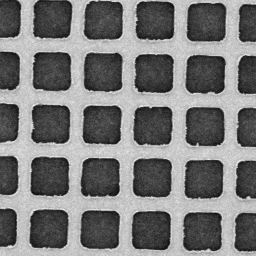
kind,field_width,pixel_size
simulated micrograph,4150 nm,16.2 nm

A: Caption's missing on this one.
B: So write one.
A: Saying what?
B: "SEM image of a regular array of holes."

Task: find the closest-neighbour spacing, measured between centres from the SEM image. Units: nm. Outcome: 828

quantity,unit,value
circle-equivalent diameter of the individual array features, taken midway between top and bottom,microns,0.69